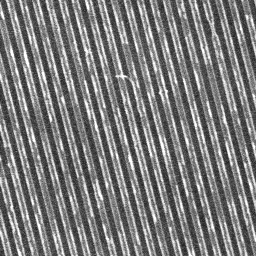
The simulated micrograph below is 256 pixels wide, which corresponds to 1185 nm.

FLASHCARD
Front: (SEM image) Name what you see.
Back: parallel lines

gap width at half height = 0.0309 microns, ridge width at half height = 27.5 nm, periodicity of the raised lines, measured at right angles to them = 12.7 px